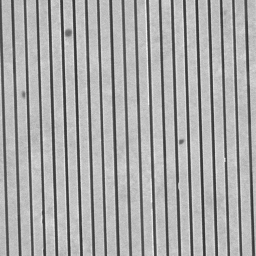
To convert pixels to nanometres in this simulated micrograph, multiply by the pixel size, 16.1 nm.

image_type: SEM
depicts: parallel lines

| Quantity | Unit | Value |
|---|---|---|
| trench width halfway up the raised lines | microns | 0.0462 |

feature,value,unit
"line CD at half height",151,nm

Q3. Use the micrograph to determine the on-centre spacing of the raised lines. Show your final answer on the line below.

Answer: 197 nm